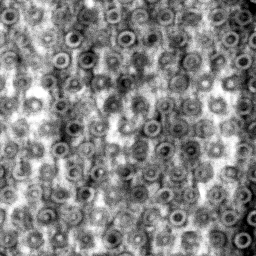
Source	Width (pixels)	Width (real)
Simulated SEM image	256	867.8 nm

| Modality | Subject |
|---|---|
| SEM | a regular array of ring-shaped raised bodies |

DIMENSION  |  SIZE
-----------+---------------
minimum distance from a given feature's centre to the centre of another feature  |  86.2 nm